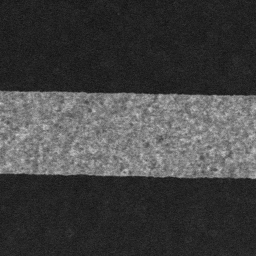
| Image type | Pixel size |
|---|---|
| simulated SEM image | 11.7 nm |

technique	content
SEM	one or a few lines or trenches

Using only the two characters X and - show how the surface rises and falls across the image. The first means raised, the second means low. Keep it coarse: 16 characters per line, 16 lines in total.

----------------
----------------
----------------
----------------
----------------
----------------
XXXXXXXXXXXXXXXX
XXXXXXXXXXXXXXXX
XXXXXXXXXXXXXXXX
XXXXXXXXXXXXXXXX
XXXXXXXXXXXXXXXX
----------------
----------------
----------------
----------------
----------------